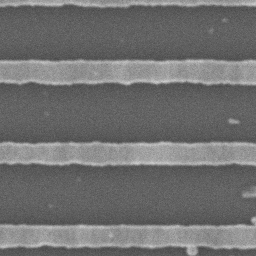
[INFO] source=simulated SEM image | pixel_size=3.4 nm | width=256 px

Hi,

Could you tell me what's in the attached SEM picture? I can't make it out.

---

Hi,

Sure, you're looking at lines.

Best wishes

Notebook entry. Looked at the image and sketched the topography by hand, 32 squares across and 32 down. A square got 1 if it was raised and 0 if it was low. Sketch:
11111111011111111111111111111111
00000000000000000000000000000000
00000000000000000000000000000000
00000000000000000000000000000000
00000000000000000000000000000000
00000000000000000000000000000000
00000000000000000000000000000000
00000000000000000000000000000000
11111111111111111111111111111111
11111111111111111111111111111111
00000011100000000000000000100111
00000000000000000000000000000000
00000000000000000000000000000000
00000000000000000000000000000000
00000000000000000000000000000000
00000000000000000000000000000000
00000000000000000000000000000000
00000000000000000000000000000000
11111111111111111111111111111111
11111111111111111111111111111111
00000111001111111111111111110011
00000000000000000000000000000000
00000000000000000000000000000000
00000000000000000000000000000000
00000000000000000000000000000000
00000000000000000000000000000000
00000000000000000000000000000000
00000000000000000000000000000000
11111111111111111111111111111111
11111111111111111111111111111111
11111111111111111111111111111111
00000000000000000000000000000000